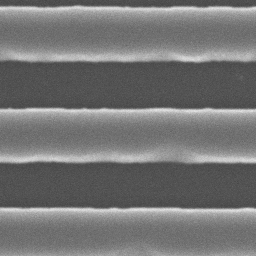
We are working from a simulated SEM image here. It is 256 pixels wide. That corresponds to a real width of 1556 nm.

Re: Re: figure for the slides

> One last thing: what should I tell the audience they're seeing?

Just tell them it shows lines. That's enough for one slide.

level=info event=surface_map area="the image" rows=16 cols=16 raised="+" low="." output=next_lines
++++++++..++.+++
++++++++++++++++
++++++++++++++++
++++++++++++++++
................
................
................
++++++++++++++++
++++++++++++++++
++++++++++++++++
................
................
................
++++++++++++++++
++++++++++++++++
++++++++++++++++